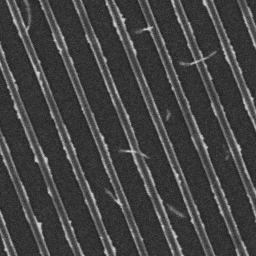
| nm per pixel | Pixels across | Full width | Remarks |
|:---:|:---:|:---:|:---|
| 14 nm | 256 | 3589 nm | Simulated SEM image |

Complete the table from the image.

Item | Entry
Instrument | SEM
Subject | parallel lines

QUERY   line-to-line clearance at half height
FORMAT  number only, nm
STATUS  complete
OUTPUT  310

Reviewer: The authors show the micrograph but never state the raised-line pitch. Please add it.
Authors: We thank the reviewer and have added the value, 430 nanometres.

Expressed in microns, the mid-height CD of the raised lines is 0.119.